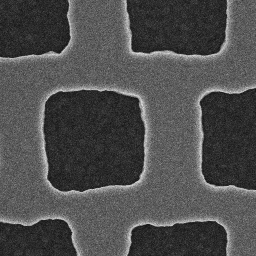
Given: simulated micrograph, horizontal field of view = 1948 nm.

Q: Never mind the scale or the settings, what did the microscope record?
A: holes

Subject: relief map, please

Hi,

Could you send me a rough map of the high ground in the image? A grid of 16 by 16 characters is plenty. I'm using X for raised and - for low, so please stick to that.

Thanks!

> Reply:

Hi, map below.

----XXXX------XX
----XXXX------XX
----XXXX------XX
--XXXXXXXXXXXXXX
XXXXXXXXXXXXXXXX
XXXXXXXXXXXXXXXX
XXX------XXXX---
XXX------XXXX---
XXX------XXXX---
XXX------XXXX---
XXX------XXXX---
XXX-----XXXXX---
XXXXXXXXXXXXXXXX
XXXXXXXXXXXXXXXX
----XXXX------XX
-----XXX------XX